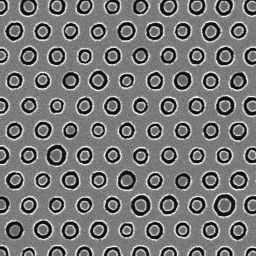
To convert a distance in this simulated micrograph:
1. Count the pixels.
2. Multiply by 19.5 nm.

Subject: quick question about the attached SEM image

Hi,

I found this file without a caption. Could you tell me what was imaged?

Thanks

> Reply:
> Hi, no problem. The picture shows a regular array of ring-shaped grooves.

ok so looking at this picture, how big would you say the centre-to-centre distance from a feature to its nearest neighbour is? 537 nm